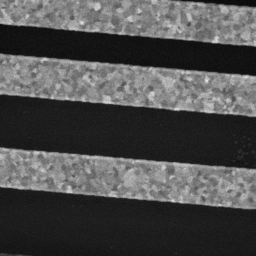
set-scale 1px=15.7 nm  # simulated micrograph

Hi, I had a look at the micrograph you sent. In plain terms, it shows lines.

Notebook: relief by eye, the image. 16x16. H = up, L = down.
HHHHHHHHHHHHHHHH
HHHHHHHHHHHHHHHH
LLLLLLLLLLLLHHHH
HLLLLLLLLLLLLLLL
HHHHHHHHHHHHHLLL
HHHHHHHHHHHHHHHH
LLLLLLLHHHHHHHHH
LLLLLLLLLLLLLLLL
LLLLLLLLLLLLLLLL
HHHLLLLLLLLLLLLL
HHHHHHHHHHHHHHHL
HHHHHHHHHHHHHHHH
LLLLLLLLLHHHHHHH
LLLLLLLLLLLLLLLL
LLLLLLLLLLLLLLLL
LLLLLLLLLLLLLLLL